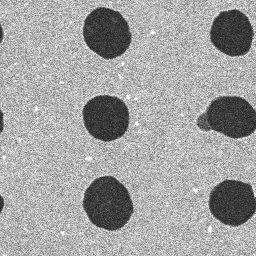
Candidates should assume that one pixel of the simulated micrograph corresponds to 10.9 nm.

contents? holes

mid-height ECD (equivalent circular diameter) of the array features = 48.3 pixels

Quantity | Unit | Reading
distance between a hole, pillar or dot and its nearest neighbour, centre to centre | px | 85.3